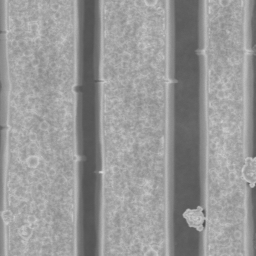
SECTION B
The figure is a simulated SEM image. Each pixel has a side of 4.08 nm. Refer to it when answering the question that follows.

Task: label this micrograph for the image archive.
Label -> one or a few lines or trenches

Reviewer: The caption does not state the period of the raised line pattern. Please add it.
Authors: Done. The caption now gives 377 nanometres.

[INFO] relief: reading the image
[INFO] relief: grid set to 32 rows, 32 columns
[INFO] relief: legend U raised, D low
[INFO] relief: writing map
UUUUUUUUUUDDUUUUUUUUUDDDDUUUUUUD
DUUUUUUUUUDDUUUUUUUUUDDDDUUUUUUD
DUUUUUUUUUDDUUUUUUUUUDDDDUUUUUUD
DUUUUUUUUUDDDUUUUUUUUDDDDUUUUUUD
DUUUUUUUUUDDDUUUUUUUUDDDDUUUUUUD
DUUUUUUUUUDDDUUUUUUUUDDDDUUUUUUD
DUUUUUUUUUDDDUUUUUUUUDDDDUUUUUUD
DUUUUUUUUUDDUUUUUUUUUDDDDUUUUUUD
DUUUUUUUUUDDUUUUUUUUUDDDDUUUUUUD
DUUUUUUUUUDDUUUUUUUUUDDDDDUUUUUD
DUUUUUUUUUDDUUUUUUUUUDDDDDUUUUUD
DUUUUUUUUUDDUUUUUUUUUDDDDDUUUUUD
DUUUUUUUUUDDUUUUUUUUUDDDDDUUUUUD
DUUUUUUUUUDDUUUUUUUUUDDDDDUUUUUD
DUUUUUUUUUDDUUUUUUUUUDDDDDUUUUUD
DUUUUUUUUUDDUUUUUUUUUDDDDDUUUUUD
DUUUUUUUUUDDUUUUUUUUUDDDDDUUUUUD
DUUUUUUUUUDDUUUUUUUUUDDDDDUUUUUD
UUUUUUUUUUDDDUUUUUUUUDDDDDUUUUUD
UUUUUUUUUUDDDUUUUUUUUDDDDDUUUUUD
UUUUUUUUUUDDDUUUUUUUUDDDDDUUUUUU
UUUUUUUUUUDDDUUUUUUUUDDDDDUUUUUU
UUUUUUUUUUDDDUUUUUUUUDDDDDUUUUUU
UUUUUUUUUUDDDUUUUUUUUDDDDDUUUUUD
UUUUUUUUUUDDDUUUUUUUUDDDDDUUUUUD
UUUUUUUUUUDDDUUUUUUUUDDDDUUUUUUD
UUUUUUUUUUDDUUUUUUUUUDDUUUUUUUUD
UUUUUUUUUUDDUUUUUUUUUDDUUUUUUUUD
UUUUUUUUUUDDUUUUUUUUUDDDUUUUUUUD
UUUUUUUUUUDDUUUUUUUUUDDDDUUUUUUD
UUUUUUUUUUDDUUUUUUUUUDDDDUUUUUUD
UUUUUUUUUUDDUUUUUUUUUDDDDUUUUUUD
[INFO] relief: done